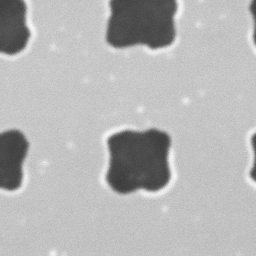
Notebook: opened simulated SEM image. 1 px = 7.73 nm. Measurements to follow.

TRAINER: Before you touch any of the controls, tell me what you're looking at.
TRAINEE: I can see holes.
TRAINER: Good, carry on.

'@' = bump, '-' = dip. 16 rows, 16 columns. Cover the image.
--@@@@@----@@@@@
--@@@@@----@@@@@
--@@@@@----@@@@@
@@@@@@@@@@@@@@@@
@@@@@@@@@@@@@@@@
@@@@@@@@@@@@@@@@
@@@@@@@@@@@@@@@@
@@@@@@@@@@@@@@@@
--@@@@@----@@@@@
--@@@@@----@@@@@
-@@@@@@----@@@@@
-@@@@@@---@@@@@@
@@@@@@@@@@@@@@@@
@@@@@@@@@@@@@@@@
@@@@@@@@@@@@@@@@
@@@@@@@@@@@@@@@@